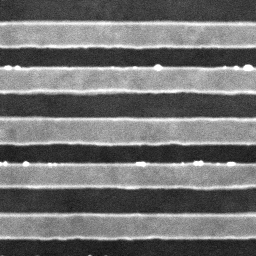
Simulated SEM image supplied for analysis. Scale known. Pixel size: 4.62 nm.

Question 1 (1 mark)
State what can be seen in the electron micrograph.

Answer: lines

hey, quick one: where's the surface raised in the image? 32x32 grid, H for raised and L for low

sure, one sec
LLLLLLLLLLLLLLLLLLLLLLLLLLLLLLLL
LLLLLLLLLLLLLLLLLLLLLLLLLLLLLLLL
LLLLLLLLLLLLLLLLLLLLLLLLLLLLLLLL
HHHHHHHHHHHHHHHHHHHHHHHHHHHHHHHH
HHHHHHHHHHHHHHHHHHHHHHHHHHHHHHHH
HHHHHHHHHHHHHHHHHHHHHHHHHHHHHHHH
LLLLLLLLLLLLLLLLLLLLLLLLLLLLLLLL
LLLLLLLLLLLLLLLLLLLLLLLLLLLLLLLL
HHHLLLLLLLLLLLHLHLLHHLLLLLLLHHHH
HHHHHHHHHHHHHHHHHHHHHHHHHHHHHHHH
HHHHHHHHHHHHHHHHHHHHHHHHHHHHHHHH
HLHHLLLLLLLLLLLLLLLHLLLLLLHHHHLH
LLLLLLLLLLLLLLLLLLLLLLLLLLLLLLLL
LLLLLLLLLLLLLLLLLLLLLLLLLLLLLLLL
LLLLLLLLLLLLLLLLLLLLLLLLLLLLLLLL
HHHHHHHHHHHHHHHHHHHHHHHHHHHHHHHH
HHHHHHHHHHHHHHHHHHHHHHHHHHHHHHHH
HHHHHHHHHHHHHHHHHHHHHHHHHHHHHHHH
LLLLLLLLLLLLLLLLLLLLLLLLLLLLLLLL
LLLLLLLLLLLLLLLLLLLLLLLLLLLLLLLL
HHHHHHHHHLLHLLHLLHHHLHHHHHHHHHLL
HHHHHHHHHHHHHHHHHHHHHHHHHHHHHHHH
HHHHHHHHHHHHHHHHHHHHHHHHHHHHHHHH
LLLLLLLLLLLLLLLHHHLLLLLLHHHLLLLL
LLLLLLLLLLLLLLLLLLLLLLLLLLLLLLLL
LLLLLLLLLLLLLLLLLLLLLLLLLLLLLLLL
LLLLLLLLLLLLLLLLLLLLLLLLLLLLLLLL
HHHHHHHHHHHHHHHHHHHHHHHHHHHHHHHH
HHHHHHHHHHHHHHHHHHHHHHHHHHHHHHHH
HHHHHHHHHHHHHHHHHHHHHHHHHHHHHHHH
LLLLLLLLLLLLLLLLLLLLLLLLLLLLLLLL
LLLLLLLLLLLLLLLLLLLLLLLLLLLLLLLL